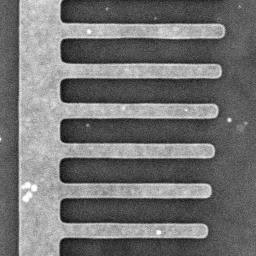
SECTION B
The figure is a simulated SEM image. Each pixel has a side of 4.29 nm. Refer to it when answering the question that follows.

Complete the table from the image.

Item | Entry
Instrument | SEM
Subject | groups of lines, slits or small figures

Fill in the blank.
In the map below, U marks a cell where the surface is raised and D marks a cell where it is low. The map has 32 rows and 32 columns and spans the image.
DDDUUUUUDDDDDDDDDDDDDDDDDDDDDDDD
DDDUUUUDDDDDDDDDDDDDDDDDDDDDDDDD
DDDUUUUUDDDDDDDDDDDDDDDDDDDDDDDD
DDDUUUUUUUUUUUUUUUUUUUUUUUUUDDDD
DDDUUUUUUUUUUUUUUUUUUUUUUUUUDDDD
DDDUUUUUDDDDDDDDDDDDDDDDDDDDDDDD
DDDUUUUDDDDDDDDDDDDDDDDDDDDDDDDD
DDDUUUUUDDDDDDDDDDDDDDDDDDDDDDDD
DDDUUUUUUUUUUUUUUUUUUUUUUUUUDDDD
DDDUUUUUUUUUUUUUUUUUUUUUUUUDDDDD
DDDUUUUDDDDDDDDDDDDDDDDDDDDDDDDD
DDDUUUUDDDDDDDDDDDDDDDDDDDDDDDDD
DDUUUUUUDDDDDDDDDDDDDDDDDDDDDDDD
DDUUUUUUUUUUUUUUUUUUUUUUUUUDDDDD
DDUUUUUUUUUUUUUUUUUUUUUUUUUDDDDD
DDDUUUUDDDDDDDDDDDDDDDDDDDDDDDDD
DDUUUUUDDDDDDDDDDDDDDDDDDDDDDDDD
DDUUUUUUDDDDDDDDDDDDDDDDDDDDDDDD
DDUUUUUUUUUUUUUUUUUUUUUUUUUDDDDD
DDUUUUUUUUUUUUUUUUUUUUUUUUDDDDDD
DDUUUUUDDDDDDDDDDDDDDDDDDDDDDDDD
DDUUUUUDDDDDDDDDDDDDDDDDDDDDDDDD
DDUUUUUUDDDDDDDDDDDDDDDDDDDDDDDD
DDUUUUUUUUUUUUUUUUUUUUUUUUDDDDDD
DDUUUUUUUUUUUUUUUUUUUUUUUUDDDDDD
DDUUUUUDDDDDDDDDDDDDDDDDDDDDDDDD
DDUUUUUDDDDDDDDDDDDDDDDDDDDDDDDD
DDDUUUUUDDDDDDDDDDDDDDDDDDDDDDDD
DDDUUUUUUUUUUUUUUUUUUUUUUUDDDDDD
DDUUUUUUUUUUUUUUUUUUUUUUUUDDDDDD
DDUUUUUDDDDDDDDDDDDDDDDDDDDDDDDD
DDUUUUUDDDDDDDDDDDDDDDDDDDDDDDDD